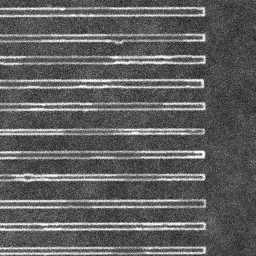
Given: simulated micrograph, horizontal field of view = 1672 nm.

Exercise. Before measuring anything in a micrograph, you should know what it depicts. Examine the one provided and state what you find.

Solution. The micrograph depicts parallel lines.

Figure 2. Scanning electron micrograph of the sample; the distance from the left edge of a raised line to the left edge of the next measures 156 nm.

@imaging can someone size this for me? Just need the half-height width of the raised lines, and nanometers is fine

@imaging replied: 42.5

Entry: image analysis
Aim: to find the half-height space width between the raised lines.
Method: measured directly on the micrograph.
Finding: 109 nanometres